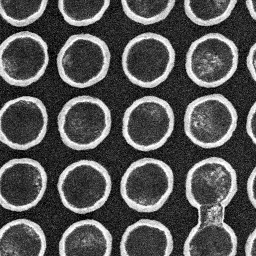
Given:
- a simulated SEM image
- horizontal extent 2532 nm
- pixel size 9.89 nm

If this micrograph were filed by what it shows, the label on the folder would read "a regular array of raised bodies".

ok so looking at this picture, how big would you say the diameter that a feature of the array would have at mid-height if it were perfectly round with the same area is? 484 nm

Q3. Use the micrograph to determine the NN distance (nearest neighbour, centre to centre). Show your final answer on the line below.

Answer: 0.606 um